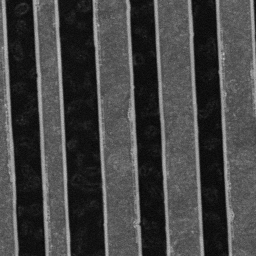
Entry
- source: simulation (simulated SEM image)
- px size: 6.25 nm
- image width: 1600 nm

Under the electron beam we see one or a few lines or trenches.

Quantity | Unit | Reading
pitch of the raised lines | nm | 396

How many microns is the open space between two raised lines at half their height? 0.184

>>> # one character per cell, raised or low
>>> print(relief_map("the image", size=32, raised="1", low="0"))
00001110000011110000111100011110
00001110000011110000111100011110
00000110000011110000111100011110
10000110000011110000111100011111
10000110000011110000111100011111
10000110000011110000111100011111
10000110000011110000111100001111
10000110000011110000111100001111
10000110000011110000111100001111
10000110000011110000111100001111
10000110000011111000111100001111
10000111000011110000111100001111
10000111000011111000111100001111
10000111000001111000111100001111
10000111000001111000111100001111
10000111000001111000111100001111
10000111000001111000111100001111
10000111000001111000111110001111
10000111000001111000111110001111
10000111000001111000011110001111
11000111000001111000011110001111
11000011000001111000011110001111
11000011000001111000011110001111
11000011000001111000011110001111
11000011000001111000011110001111
11000011000001111000011110001111
11000011000001111000011110000111
11000011000001111000011110000111
11000011000001111000011110000111
11000011000001111000011110000111
11000011000001111000011110000111
11000011100001111000011110000111